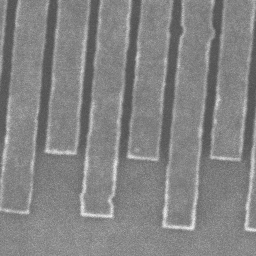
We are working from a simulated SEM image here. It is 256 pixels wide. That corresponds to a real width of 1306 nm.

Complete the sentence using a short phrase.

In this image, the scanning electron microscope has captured parallel lines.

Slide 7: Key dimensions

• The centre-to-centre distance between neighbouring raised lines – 210 nm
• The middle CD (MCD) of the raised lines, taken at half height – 156 nm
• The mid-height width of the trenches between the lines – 55.2 nm